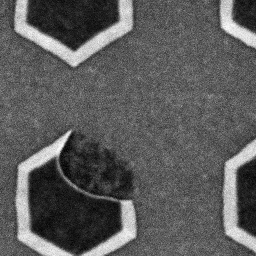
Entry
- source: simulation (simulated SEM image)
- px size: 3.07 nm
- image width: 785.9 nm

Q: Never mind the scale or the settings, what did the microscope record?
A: raised bodies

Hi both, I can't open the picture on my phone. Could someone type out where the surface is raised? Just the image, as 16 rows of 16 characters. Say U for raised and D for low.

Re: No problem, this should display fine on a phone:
DUUUUUUUDDDDDDUU
DUUUUUUUDDDDDDUU
DDDUUUDDDDDDDDDD
DDDDUDDDDDDDDDDD
DDDDDDDDDDDDDDDD
DDDDDDDDDDDDDDDD
DDDDDDDDDDDDDDDD
DDDDDDDDDDDDDDDD
DDDDDDDDDDDDDDDD
DDDUDDDDDDDDDDDD
DDUUDDDDDDDDDDUU
DUUUUDDDDDDDDDUU
DUUUUUUUDDDDDDUU
DUUUUUUUDDDDDDUU
DDUUUUUUDDDDDDDU
DDDUUUUDDDDDDDDD